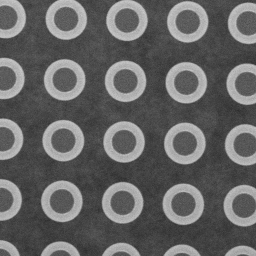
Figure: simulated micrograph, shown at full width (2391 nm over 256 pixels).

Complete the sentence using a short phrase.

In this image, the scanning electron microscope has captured an array of small figures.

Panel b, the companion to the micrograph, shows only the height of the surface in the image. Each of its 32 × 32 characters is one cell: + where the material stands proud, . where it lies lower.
+++....+++....+++.....+++.....++
+++...+++++...++++...+++++...+++
+++...+++++..+++++...+++++...+++
+++...+++++...++++...+++++...+++
++.....+++....++++....+++....+++
................................
................................
++......+.......................
+++...++++....++++...++++....+++
+++...+++++..+++++...+++++...+++
+++...+++++..+++++...+++++..++++
++....++++....++++...+++++...+++
...............++.....+++....+++
................................
................................
++....+++.....+++.....++........
+++...++++...+++++...++++....+++
+++..+++++...+++++...+++++..++++
+++..+++++...+++++...+++++..++++
++....++++....+++....++++....+++
..............................++
................................
+...............................
++....++++....+++....+++.....+++
+++..+++++...+++++...++++...++++
+++..+++++...+++++..+++++...++++
++....++++...+++++...++++...++++
+......++.....+++....++++....+++
................................
................................
+.....+++.....++................
++...+++++...++++....++++...++++